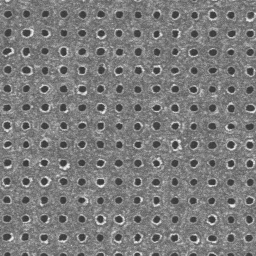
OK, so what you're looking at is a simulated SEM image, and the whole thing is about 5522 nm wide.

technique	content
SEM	a regular array of holes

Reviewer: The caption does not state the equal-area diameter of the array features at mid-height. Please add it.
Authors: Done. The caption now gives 161 nm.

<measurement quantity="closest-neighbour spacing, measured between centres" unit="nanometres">392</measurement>